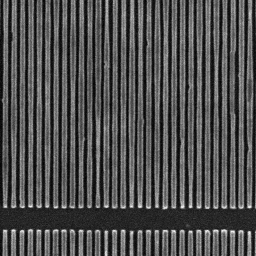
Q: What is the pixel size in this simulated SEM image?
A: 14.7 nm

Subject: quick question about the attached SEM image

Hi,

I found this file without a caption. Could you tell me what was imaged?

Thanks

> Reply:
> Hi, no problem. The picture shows parallel lines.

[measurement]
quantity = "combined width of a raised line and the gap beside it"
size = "8.42 px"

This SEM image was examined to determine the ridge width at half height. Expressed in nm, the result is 51.3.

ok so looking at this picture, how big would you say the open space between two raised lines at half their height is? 62.3 nanometers